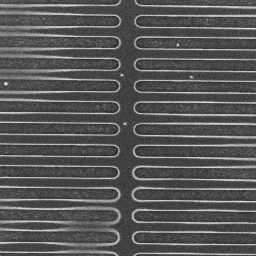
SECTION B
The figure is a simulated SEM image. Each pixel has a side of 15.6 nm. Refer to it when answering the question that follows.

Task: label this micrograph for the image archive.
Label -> groups of lines, slits or small figures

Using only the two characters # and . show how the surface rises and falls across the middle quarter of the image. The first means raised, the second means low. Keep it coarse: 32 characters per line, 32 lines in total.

..............####..............
..########..#######.............
################################
################################
.............#####..............
..............####..............
.............#####..............
################################
################################
.............######.............
..............####..............
..............####..............
####################............
################################
################################
.............#####..............
..............####..............
.............#####..............
################################
################################
.............######.............
..............####..............
..............####..............
############################....
################################
...........########..###########
..............###...............
..............###...............
.............#####..............
################################
################################
.............#####..............